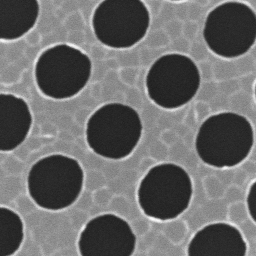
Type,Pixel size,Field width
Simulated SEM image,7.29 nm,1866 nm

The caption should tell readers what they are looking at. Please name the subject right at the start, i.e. holes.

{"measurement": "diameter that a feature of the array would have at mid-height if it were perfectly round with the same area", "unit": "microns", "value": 0.407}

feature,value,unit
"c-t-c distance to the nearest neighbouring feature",0.569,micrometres